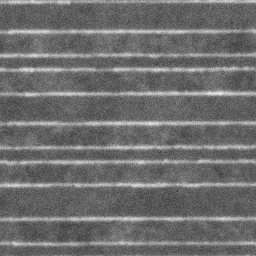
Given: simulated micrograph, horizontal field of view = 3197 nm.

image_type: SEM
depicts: lines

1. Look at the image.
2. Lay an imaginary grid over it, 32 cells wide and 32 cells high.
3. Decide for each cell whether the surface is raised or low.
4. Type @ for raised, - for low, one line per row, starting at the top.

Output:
--------------------------------
--------------------------------
--------------------------------
--------------------------------
@@@@@@@@@@@@@@@@@@@@@@@@@@@@@@@@
@@@@@@@@@@@@@@@@@@@@@@@@@@@@@@@@
@@@@@@@@@@@@@@@@@@@@@@@@@@@@@@@@
--------------------------------
--------------------------------
@@@@@@@@@@@@@@@@@@@@@@@@@@@@@@@@
@@@@@@@@@@@@@@@@@@@@@@@@@@@@@@@@
@@@@@@@@@@@@@@@@@@@@@@@@@@@@@@@@
--------------------------------
--------------------------------
--------------------------------
@@@@@@@@@@@@@@@@@@@@@@@@@@@@@@@@
@@@@@@@@@@@@@@@@@@@@@@@@@@@@@@@@
@@@@@@@@@@@@@@@@@@@@@@@@@@@@@@@@
--------------------------------
--------------------------------
@@@@@@@@@@@@@@@@@@@@@@@@@@@@@@@@
@@@@@@@@@@@@@@@@@@@@@@@@@@@@@@@@
@@@@@@@@@@@@@@@@@@@@@@@@@@@@@@@@
--------------------------------
--------------------------------
--------------------------------
--------------------------------
@@@@@@@@@@@@@@@@@@@@@@@@@@@@@@@@
@@@@@@@@@@@@@@@@@@@@@@@@@@@@@@@@
@@@@@@@@@@@@@@@@@@@@@@@@@@@@@@@@
------@@@-----------------------
--------------------------------